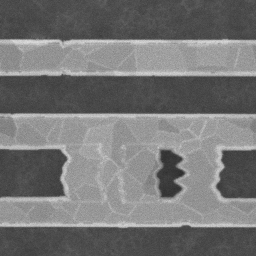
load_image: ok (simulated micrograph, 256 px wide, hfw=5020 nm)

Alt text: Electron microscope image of one or a few lines or trenches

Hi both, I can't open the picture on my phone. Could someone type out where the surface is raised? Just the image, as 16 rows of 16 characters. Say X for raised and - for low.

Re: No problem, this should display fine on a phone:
----------------
----------------
----------------
XXXXXXXXXXXXXXXX
XXXXXXXXXXXXXXXX
----------------
----------------
XXXXXXXXXXXXXXXX
XXXXXXXXXXXXXXXX
----XXXXXX-XXX--
----XXXXXX-XXX--
----XXXXXX-XX---
XXXXXXXXXXXXXX--
XXXXXXXXXXXXXXXX
----------------
----------------